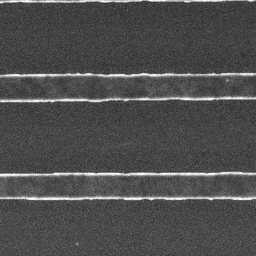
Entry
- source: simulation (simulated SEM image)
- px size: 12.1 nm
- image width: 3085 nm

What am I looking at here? lines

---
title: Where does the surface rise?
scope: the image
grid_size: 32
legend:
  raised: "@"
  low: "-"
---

--------------------------------
--------------------------------
--------------------------------
--------------------------------
--------------------------------
--------------------------------
--------------------------------
--------------------------------
--------------------------------
@@@@@@@@@@@@@@@@@@@@@@@@@@@@@@@@
@@@@@@@@@@@@@@@@@@@@@@@@@@@@@@@@
@@@@@@@@@@@@@@@@@@@@@@@@@@@@@@@@
@@@@@@@@@@@@@@-@----------------
--------------------------------
--------------------------------
--------------------------------
--------------------------------
--------------------------------
--------------------------------
--------------------------------
--------------------------------
--------------------------------
@@@@@@@@@@@@@@@@@@@@@@@@@@@@@@@@
@@@@@@@@@@@@@@@@@@@@@@@@@@@@@@@@
@@@@@@@@@@@@@@@@@@@@@@@@@@@@@@@@
--------------------------------
--------------------------------
--------------------------------
--------------------------------
--------------------------------
--------------------------------
--------------------------------